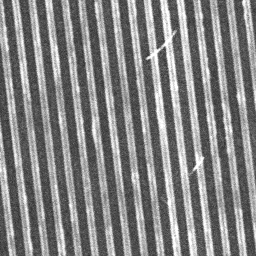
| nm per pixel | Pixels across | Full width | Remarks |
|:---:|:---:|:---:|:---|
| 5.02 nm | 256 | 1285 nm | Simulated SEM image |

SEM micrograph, parallel lines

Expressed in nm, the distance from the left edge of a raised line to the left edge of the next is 82.1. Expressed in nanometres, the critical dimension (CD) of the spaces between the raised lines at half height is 50.4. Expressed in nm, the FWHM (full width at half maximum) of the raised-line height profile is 29.9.